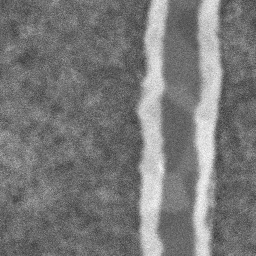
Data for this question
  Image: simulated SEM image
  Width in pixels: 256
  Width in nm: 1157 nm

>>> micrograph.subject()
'one or a few lines or trenches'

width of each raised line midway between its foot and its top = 246 nanometres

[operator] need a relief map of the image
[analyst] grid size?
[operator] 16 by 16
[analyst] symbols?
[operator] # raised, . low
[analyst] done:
..........###...
..........###...
.........####...
..........###...
..........###...
..........###...
.........####...
.........####...
.........####...
..........###...
.........####...
.........####...
.........####...
.........###....
.........####...
.........####...